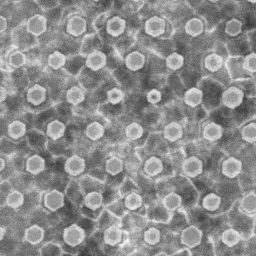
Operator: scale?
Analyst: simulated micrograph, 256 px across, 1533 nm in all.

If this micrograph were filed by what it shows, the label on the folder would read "a regular array of raised bodies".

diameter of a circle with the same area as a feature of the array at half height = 17.2 pixels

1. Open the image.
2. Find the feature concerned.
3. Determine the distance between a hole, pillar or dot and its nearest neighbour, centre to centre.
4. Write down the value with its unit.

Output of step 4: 233 nm